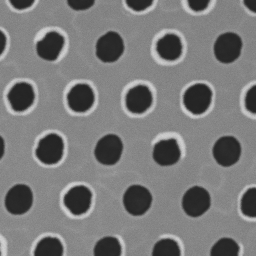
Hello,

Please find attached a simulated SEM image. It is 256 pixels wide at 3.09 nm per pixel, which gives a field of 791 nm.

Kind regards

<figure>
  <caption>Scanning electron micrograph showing a regular array of holes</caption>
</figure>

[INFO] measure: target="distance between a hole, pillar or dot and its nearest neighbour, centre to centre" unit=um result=0.18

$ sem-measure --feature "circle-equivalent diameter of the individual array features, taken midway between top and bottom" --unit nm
89.1